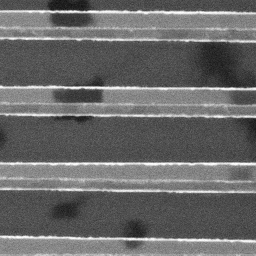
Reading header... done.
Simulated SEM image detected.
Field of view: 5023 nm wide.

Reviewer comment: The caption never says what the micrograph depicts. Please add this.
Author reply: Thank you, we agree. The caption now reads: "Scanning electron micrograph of lines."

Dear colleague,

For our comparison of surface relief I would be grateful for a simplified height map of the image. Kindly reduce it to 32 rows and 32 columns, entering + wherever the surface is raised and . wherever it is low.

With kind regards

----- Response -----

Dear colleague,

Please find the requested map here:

................................
++++++++++.+....................
++++++++++++++++++++++++++++++++
++++++++++++++++++++++++++++++++
++++++++++++++++++++++++++++++++
................................
................................
................................
................................
................................
................................
++++++++++++++++++++++++++++++++
++++++++++++++++++++++++++++++++
++++++++++++++++++++++++++++++++
..................++++++++++++++
................................
................................
................................
................................
................................
++++++++++++++++++++++++++++++++
++++++++++++++++++++++++++++++++
++++++++++++++++++++++++++++++++
++++++++++++++++++++++++++++++++
................................
................................
................................
................................
................................
................................
++++++++++++++++++++++++++++++++
++++++++++++++++++++++++++++++++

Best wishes